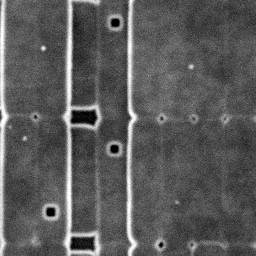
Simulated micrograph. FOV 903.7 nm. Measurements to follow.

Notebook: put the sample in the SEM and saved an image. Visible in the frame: wiring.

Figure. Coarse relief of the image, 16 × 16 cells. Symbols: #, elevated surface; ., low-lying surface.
####....########
####....########
####....########
####....########
####....########
####....########
####....########
####....########
####....########
####....########
####....########
####....########
####....########
####....########
####....########
####....########